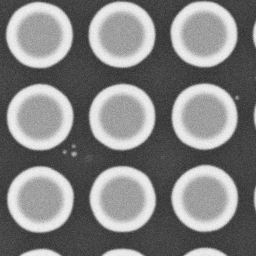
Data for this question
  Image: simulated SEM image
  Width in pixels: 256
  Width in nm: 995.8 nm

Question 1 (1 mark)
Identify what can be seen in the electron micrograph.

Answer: an array of small figures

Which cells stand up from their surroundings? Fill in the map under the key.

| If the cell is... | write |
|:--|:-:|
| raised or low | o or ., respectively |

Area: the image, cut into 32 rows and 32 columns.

....oo........ooo.......ooo.....
..oooooo....oooooo....ooooooo...
.oooooooo...ooooooo...ooooooo...
.oooooooo..oooooooo..ooooooooo..
.oooooooo..oooooooo..ooooooooo..
.oooooooo..oooooooo...ooooooo...
.ooooooo....ooooooo...ooooooo...
..oooooo.....ooooo.....ooooo....
................................
................................
.........................o......
..oooooo.....ooooo.....ooooo....
..ooooooo...ooooooo...ooooooo...
.oooooooo..oooooooo...oooooooo..
.oooooooo..oooooooo..ooooooooo..
.oooooooo..oooooooo...oooooooo..
.oooooooo...ooooooo...ooooooo...
..oooooo....oooooo.....ooooo....
....oo........ooo.......ooo.....
................................
................................
...oooo......ooooo.....ooooo....
..oooooo....ooooooo...ooooooo...
.oooooooo..oooooooo...ooooooo...
.oooooooo..oooooooo..ooooooooo..
.oooooooo..oooooooo...oooooooo..
.oooooooo...ooooooo...ooooooo...
..oooooo....ooooooo....oooooo...
...oooo......oooo.......oooo....
................................
................................
...oooo......oooo.......oooo....